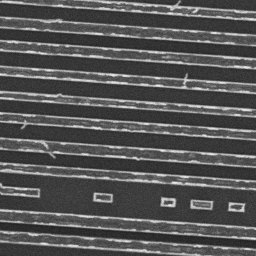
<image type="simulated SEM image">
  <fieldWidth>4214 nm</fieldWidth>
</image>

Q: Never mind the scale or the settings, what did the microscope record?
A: parallel lines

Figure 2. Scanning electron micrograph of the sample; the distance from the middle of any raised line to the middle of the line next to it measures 0.393 um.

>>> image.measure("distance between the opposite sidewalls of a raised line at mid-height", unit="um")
0.165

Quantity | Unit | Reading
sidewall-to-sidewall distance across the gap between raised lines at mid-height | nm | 238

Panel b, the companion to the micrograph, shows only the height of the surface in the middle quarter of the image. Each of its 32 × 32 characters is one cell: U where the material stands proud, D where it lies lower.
DDDDDDDDDDDDDDDDDDDDDDDDDDDDDDDD
DDDDDDDDDDDDDDDDDDDDDDDDDDDDDDDD
UUUUUUUUUUDDDDDDDDDDDDDDDDDDDDDD
UUUUUUUUUUUUUUUUUUUUUUUUDDDDDDDD
DDDDDDDDDUUUUUUUUUUUUUUUUUUUUUUU
DDDDDDDDDDDDDDDDDDDDDDDUUUUUUUUU
DDDDDDDDDDDDDDDDDDDDDDDDDDDDDDDD
DDDDDDDDDDDDDDDDDDDDDDDDDDDDDDDD
UUUUUDDDDDDDDDDDDDDDDDDDDDDDDDDD
UUUUUUUUUUUUUUUUUUUDUUDDDDDDDDDD
DDDDDDDDDDUUUUUUUUUUUUUUUUUUUUUU
DDDDDDDDDDDDDDDDDDDDDDDDUUUUUUUU
DDDDDDDDDDDDDDDDDDDDDDDDDDDDDDDD
UDUUUDDDDDDDDDDDDDDDDDDDDDDDDDDD
UUUUUUUUUUUUUUUUUUDDDDDDDDDDDDDD
UUUUUUUUUUUUUUUUUUUUUUUUUUUUUDDD
DDDDDDDDDDDDUUUUUUUUUUUUUUUUUUUU
DDDDDDDDDDDDDDDDDDDDDDDDDDDDUUUU
DDDDDDDDDDDDDDDDDDDDDDDDDDDDDDDD
DDDDDDDDDDDDDDDDDDDDDDDDDDDDDDDD
UUUUUUUUUUDDDDDDDDDDDDDDDDDDDDDD
UUUUUUUUUUUUUUUUUUUUUUUUDDUDDDDD
DDUUUUUUUUUUUUUUUUUUUUUUUUUUUUUU
DDDDDDDDDDDDDDDDUUUUUUUUUUUUUUUU
DDDDDDDDDDDDDDDDDDDDDDDDDDDDDDUU
DDDDDDDDDDDDDDDDDDDDDDDDDDDDDDDD
UUUUUUUUDDDDDDDDDDDDDDDDDDDDDDDD
UUUUUUUUUUUUUUUUUUUUUUDDDDDDDDDD
DDDDDDDUUUUUUUUUUUUUUUUUUUUUUUUU
DDDDDDDDDDDDDDDDDDDDUUUDUUUUUUUU
DDDDDDDDDDDDDDDDDDDDDDDDDDDDDDDD
DDDDDDDDDDDDDDDDDDDDDDDDDDDDDDDD